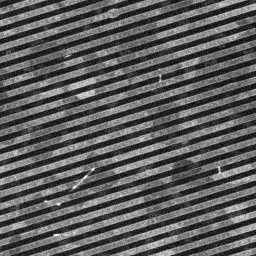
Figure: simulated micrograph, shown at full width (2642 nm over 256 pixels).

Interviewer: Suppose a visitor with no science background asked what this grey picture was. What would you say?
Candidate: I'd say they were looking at parallel lines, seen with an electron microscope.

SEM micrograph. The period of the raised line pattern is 120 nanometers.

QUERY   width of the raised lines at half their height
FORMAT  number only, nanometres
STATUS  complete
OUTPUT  53.1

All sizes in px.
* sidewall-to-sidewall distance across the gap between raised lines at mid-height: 6.58